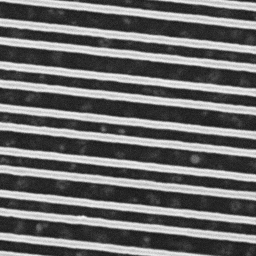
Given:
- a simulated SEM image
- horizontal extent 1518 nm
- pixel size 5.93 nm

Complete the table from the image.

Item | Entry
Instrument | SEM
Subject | parallel lines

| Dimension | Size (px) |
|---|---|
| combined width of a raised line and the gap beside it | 21.4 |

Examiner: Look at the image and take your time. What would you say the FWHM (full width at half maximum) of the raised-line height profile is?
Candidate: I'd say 39.1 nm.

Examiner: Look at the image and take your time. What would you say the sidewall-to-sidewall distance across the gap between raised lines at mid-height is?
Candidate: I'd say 99.6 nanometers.